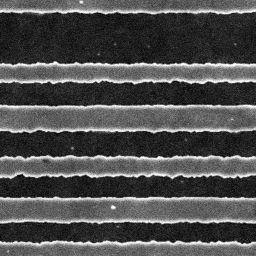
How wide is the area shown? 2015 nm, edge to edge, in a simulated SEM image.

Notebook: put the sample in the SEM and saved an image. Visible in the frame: lines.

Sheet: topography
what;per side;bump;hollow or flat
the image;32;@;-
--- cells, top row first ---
@@@@@@@@@@@@@@@@@@@@@@@@@@@@@@@@
@@@@@@@@@@@@@@@@@@@@@@@@@@@@@@@@
--------------------------------
--------------------------------
--------------------------------
--------------------------------
--------------------------------
--------------------------------
@@@@@@@@@@@@@@@@@@@@@@@@@@@@@@@@
@@@@@@@@@@@@@@@@@@@@@@@@@@@@@@@@
--------------------------------
--------------------------------
--------------------------------
@@@@@@@@@@@@@@@@@@@@@@@@@@@@@@@@
@@@@@@@@@@@@@@@@@@@@@@@@@@@@@@@@
@@@@@@@@@@@@@@@@@@@@@@@@@@@@@@@@
-@@@---@-----------@-@-------@--
--------------------------------
--------------------------------
--------@---@-------------@-----
@@@@@@@@@@@@@@@@@@@@@@@@@@@@@@@@
@@@@@@@@@@@@@@@@@@@@@@@@@@@@@@@@
--------------------------------
--------------------------------
--------------------------------
@@@@@@@@@@@@@@@@@@@@@@@@@@@@@@@@
@@@@@@@@@@@@@@@@@@@@@@@@@@@@@@@@
@@@@@@@@@@@@@@@@@@@@@@@@@@@@@@@@
--------------------------------
--------------------------------
@@@@@@@@@@@@@@@@@@@@@@@@@@@@@@@@
@@@@@@@@@@@@@@@@@@@@@@@@@@@@@@@@